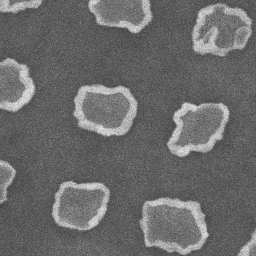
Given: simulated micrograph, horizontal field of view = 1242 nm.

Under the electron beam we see raised bodies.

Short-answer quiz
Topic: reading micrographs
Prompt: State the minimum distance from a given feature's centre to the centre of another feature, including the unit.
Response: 467 nm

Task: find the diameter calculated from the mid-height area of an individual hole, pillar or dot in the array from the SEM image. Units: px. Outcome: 54.2